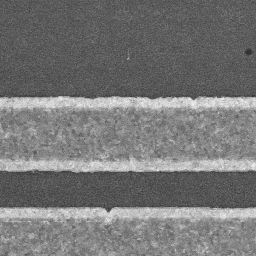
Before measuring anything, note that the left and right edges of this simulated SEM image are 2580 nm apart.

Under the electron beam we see one or a few lines or trenches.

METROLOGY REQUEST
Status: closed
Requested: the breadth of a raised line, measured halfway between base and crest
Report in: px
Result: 62.3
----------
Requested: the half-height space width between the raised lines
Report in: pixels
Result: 48.9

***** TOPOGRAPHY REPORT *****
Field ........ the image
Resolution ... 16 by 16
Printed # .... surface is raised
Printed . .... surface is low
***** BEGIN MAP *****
................
................
................
................
................
................
#########.######
################
################
################
................
................
................
################
################
################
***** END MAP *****